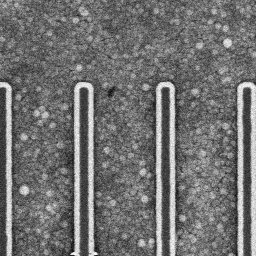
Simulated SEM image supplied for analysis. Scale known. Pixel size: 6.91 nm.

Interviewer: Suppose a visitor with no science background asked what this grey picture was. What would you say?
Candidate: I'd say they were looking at one or a few lines or trenches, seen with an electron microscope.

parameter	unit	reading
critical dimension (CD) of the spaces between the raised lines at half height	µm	0.473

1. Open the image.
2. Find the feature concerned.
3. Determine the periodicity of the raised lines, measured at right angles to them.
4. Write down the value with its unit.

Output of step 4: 562 nanometers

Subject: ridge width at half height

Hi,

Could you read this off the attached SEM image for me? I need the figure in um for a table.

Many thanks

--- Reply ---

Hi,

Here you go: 0.0941